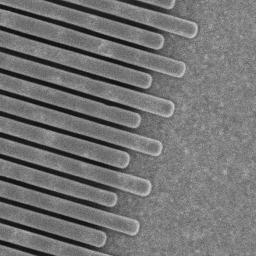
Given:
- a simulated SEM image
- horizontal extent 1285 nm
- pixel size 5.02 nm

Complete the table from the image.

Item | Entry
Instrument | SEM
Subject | parallel lines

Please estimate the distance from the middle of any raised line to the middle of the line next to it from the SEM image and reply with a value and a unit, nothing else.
103 nanometres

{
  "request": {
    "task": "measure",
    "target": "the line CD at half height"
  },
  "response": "81.9 nm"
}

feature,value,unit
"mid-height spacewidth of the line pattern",21.7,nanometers